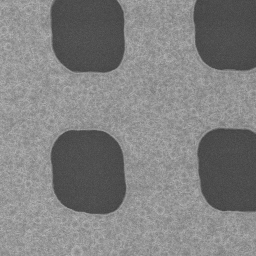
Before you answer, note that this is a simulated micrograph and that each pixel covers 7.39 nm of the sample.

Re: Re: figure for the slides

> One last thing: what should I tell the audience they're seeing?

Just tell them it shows holes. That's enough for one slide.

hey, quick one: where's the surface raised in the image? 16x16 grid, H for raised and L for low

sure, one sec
HHHLLLLLHHHHLLLL
HHHLLLLLHHHHLLLL
HHHLLLLLHHHHLLLL
HHHHLLLLHHHHHLLL
HHHHHLLHHHHHHHHH
HHHHHHHHHHHHHHHH
HHHHHHHHHHHHHHHH
HHHHHHHHHHHHHHHH
HHHHLLLHHHHHHLLL
HHHLLLLLHHHHLLLL
HHHLLLLLHHHHLLLL
HHHLLLLLHHHHHLLL
HHHHLLLLHHHHHLLL
HHHHHHHHHHHHHHHH
HHHHHHHHHHHHHHHH
HHHHHHHHHHHHHHHH